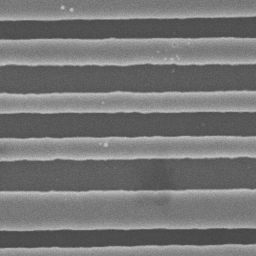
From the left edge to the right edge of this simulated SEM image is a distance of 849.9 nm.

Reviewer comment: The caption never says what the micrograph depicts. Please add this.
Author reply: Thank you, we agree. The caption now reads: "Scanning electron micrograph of lines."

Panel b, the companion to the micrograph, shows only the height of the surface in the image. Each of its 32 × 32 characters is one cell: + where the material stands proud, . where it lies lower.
++++++++++++++++++++++++++++++++
++++++++++++++++++++++++++++++++
++...++.........................
................................
................................
++++++++++++++++++++++++++++++++
++++++++++++++++++++++++++++++++
++++++++++++++++++++++++++++++++
................................
................................
................................
..............++.........+++++++
++++++++++++++++++++++++++++++++
++++++++++++++++++++++++++++++++
................................
................................
................................
++++++++++++++++++++++++++++++++
++++++++++++++++++++++++++++++++
++++++++++++++++++++++++++++++++
................................
................................
................................
................................
++++++++++++++++++++++++++++++++
++++++++++++++++++++++++++++++++
++++++++++++++++++++++++++++++++
++++++++++++++++++++++++++++++++
++++++++++++++++++++++++++..+..+
................................
................................
++++++++++++++++++++++++++++++++